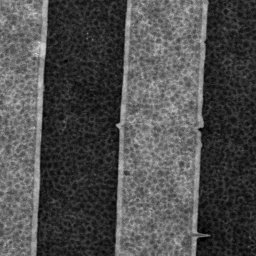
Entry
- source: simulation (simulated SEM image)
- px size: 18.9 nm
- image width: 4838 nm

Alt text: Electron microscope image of one or a few lines or trenches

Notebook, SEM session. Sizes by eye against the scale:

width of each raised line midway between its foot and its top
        1430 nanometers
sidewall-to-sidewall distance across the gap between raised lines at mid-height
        1580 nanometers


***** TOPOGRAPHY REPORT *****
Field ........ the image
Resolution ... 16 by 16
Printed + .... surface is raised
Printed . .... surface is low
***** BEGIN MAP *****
+++.....+++++...
+++.....+++++...
+++.....+++++...
+++.....+++++...
+++.....+++++...
+++.....+++++...
+++.....++++....
++......+++++...
++......++++....
++......++++....
++......++++....
++......++++....
++.....+++++....
++.....+++++....
++.....+++++....
++.....+++++....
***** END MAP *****